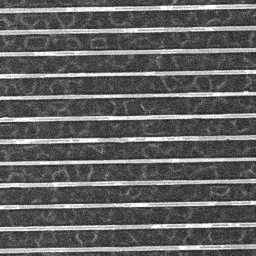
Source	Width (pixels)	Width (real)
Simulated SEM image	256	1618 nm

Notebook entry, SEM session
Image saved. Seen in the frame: parallel lines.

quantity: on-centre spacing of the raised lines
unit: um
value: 0.138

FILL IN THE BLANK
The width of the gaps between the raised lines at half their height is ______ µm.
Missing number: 0.113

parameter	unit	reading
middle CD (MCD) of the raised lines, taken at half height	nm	25.3